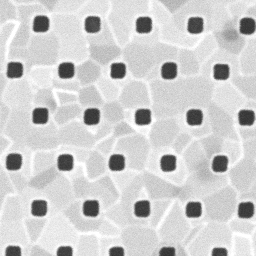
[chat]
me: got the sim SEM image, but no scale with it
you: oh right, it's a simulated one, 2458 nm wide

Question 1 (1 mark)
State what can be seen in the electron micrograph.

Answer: a regular array of holes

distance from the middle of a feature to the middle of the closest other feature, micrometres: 0.493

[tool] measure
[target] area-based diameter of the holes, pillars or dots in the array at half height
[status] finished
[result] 180 nm